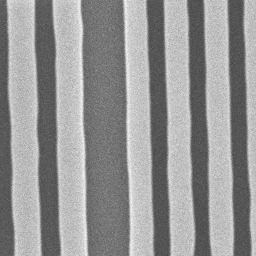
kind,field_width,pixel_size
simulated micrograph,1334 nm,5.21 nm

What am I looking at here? groups of lines, slits or small figures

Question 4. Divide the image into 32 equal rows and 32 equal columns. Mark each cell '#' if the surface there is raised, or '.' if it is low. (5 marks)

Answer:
.###...###......##...##...##...#
.###...###......##...##...##...#
.###...###......##...###..##...#
.###...###......##...###..###..#
.###...###......##...###..###..#
.###...###......##...###..###..#
.###...###......##...###..###..#
.###...###......###..###..###..#
.###...###......###..###..###..#
.###...###......###..###..###..#
.###...###......###..###..###..#
.####..###......###..###..###..#
.####..###......###..###..###..#
.####..###......###..###..###..#
.####..###......###..###..###..#
.####..###......###..###..###..#
..###..###......###..###..###..#
..###..###......###..###..###..#
..###..###......###..###..###..#
..###..###......###..###..###..#
..###..###......###..###..###..#
..###..####.....###..###..###..#
..###..####.....###..###..###..#
..###..####.....###..###..###..#
..###..####.....###..###..###..#
..###..####.....###..###..###..#
..###..####.....###..###..###..#
..###..####.....###..###..###..#
..###..####.....###..###..###..#
..###...###.....###..###..###..#
..###...###.....###..###..###...
..###...###.....###..###..###...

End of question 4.